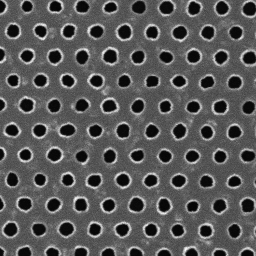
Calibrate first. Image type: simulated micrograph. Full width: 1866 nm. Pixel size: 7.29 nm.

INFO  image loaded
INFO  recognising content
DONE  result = a regular array of holes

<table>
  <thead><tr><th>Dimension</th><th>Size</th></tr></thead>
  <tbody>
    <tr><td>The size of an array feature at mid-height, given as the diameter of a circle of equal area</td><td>12.4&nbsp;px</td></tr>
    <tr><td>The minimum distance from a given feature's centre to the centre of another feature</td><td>0.2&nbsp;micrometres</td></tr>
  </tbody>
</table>